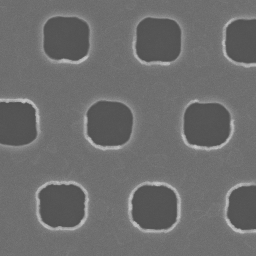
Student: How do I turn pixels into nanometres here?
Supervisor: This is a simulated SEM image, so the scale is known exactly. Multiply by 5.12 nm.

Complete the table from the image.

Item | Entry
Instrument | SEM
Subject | holes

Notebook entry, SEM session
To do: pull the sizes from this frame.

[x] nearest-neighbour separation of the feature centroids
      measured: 472 nanometers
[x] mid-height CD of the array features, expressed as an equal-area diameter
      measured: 242 nanometers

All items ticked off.